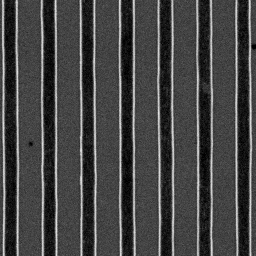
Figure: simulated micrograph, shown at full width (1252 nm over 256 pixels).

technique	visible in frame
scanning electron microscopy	parallel lines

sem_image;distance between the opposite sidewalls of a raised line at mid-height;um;0.0697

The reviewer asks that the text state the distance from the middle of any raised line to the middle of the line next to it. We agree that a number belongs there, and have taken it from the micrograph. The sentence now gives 190 nm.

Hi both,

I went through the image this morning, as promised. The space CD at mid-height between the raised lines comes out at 119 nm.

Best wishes